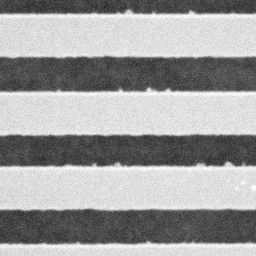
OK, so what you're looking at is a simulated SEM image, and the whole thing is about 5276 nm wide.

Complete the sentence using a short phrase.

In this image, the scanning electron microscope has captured lines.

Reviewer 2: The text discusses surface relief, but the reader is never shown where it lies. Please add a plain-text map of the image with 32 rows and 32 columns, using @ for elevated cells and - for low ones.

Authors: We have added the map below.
--------------------------------
--------------------------------
@@@@@@@@@@@@@@@@@@@@@@@@@@@@@@@@
@@@@@@@@@@@@@@@@@@@@@@@@@@@@@@@@
@@@@@@@@@@@@@@@@@@@@@@@@@@@@@@@@
@@@@@@@@@@@@@@@@@@@@@@@@@@@@@@@@
@@@@@@@@@@@@@@@@@@@@@@@@@@@@@@@@
--------------------------------
--------------------------------
--------------------------------
--------------------------------
--------------------------------
@@@@@@@@@@@@@@@@@@@@@@@@@@@@@@@@
@@@@@@@@@@@@@@@@@@@@@@@@@@@@@@@@
@@@@@@@@@@@@@@@@@@@@@@@@@@@@@@@@
@@@@@@@@@@@@@@@@@@@@@@@@@@@@@@@@
@@@@@@@@@@@@@@@@@@@@@@@@@@@@@@@@
--------------------------------
--------------------------------
--------------------------------
--------------------------------
@@@@@@@@@@@@@@@@@@@@@@@@@@@@@@@@
@@@@@@@@@@@@@@@@@@@@@@@@@@@@@@@@
@@@@@@@@@@@@@@@@@@@@@@@@@@@@@@@@
@@@@@@@@@@@@@@@@@@@@@@@@@@@@@@@@
@@@@@@@@@@@@@@@@@@@@@@@@@@@@@@@@
--------------------------------
--------------------------------
--------------------------------
--------------------------------
--------------------------------
@@@@@@@@@@@@@@@@@@@@@@@@@@@@@@@@